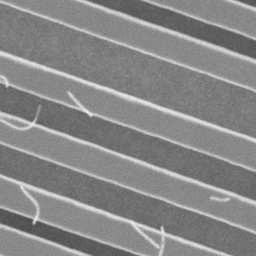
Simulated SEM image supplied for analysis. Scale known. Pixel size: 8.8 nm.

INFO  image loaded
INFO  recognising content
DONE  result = lines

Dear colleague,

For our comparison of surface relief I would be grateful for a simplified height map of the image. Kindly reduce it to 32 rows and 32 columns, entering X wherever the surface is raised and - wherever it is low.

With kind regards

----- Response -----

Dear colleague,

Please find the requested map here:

-XXXXXXXXXXX-------XXXXXXXXXXXX-
---XXXXXXXXXXXX-------XXXXXXXXXX
------XXXXXXXXXXXX-------XXXXXXX
---------XXXXXXXXXXXX-------XXXX
------------XXXXXXXXXXX--------X
---------------XXXXXXXXXXX------
------------------XXXXXXXXXXX---
XXX------------------XXXXXXXXXXX
XXXXXX------------------XXXXXXXX
XXXXXXXXX-----------------XXXXXX
XXXXXXXXXXXX-----------------XXX
---XXXXXXXXXXXX-----------------
------XXXXXXXXXXXX--------------
---------XXXXXXXXXXXX-----------
X-----------XXXXXXXXXXX---------
XXXXX----------XXXXXXXXXXX------
XXXXXXX-----------XXXXXXXXXXX---
XXXXXXXXXX-----------XXXXXXXXXXX
--XXXXXXXXXXX-----------XXXXXXXX
----XXXXXXXXXXXX-----------XXXXX
-------XXXXXXXXXXXX----------XXX
----------XXXXXXXXXXX-----------
XX-----------XXXXXXXXXXX--------
XXXXX-----------XXXXXXXXXXX-----
XXXXXXXX-----------XXXXXXXXXXX--
XXXXXXXXXX-----------XXXXXXXXXXX
-XXXXXXXXXXXX-----------XXXXXXXX
----XXXXXXXXXXXX-----------XXXXX
XX-----XXXXXXXXXXXX-----------XX
XXXXX-----XXXXXXXXXXXX----------
XXXXXXX------XXXXXXXXXXXX-------
XXXXXXXXXX------XXXXXXXXXXX-----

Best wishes